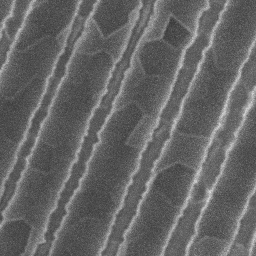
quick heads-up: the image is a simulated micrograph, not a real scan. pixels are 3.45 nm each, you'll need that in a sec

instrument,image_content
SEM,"parallel lines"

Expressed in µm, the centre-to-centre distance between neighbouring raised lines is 0.205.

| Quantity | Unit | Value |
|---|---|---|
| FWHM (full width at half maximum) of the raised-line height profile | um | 0.154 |